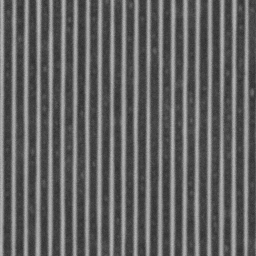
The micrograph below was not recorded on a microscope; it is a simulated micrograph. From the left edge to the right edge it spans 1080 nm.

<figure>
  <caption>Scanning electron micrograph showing parallel lines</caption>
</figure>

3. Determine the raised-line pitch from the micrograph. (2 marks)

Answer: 51.6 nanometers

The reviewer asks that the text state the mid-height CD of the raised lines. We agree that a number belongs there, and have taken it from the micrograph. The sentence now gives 12.1 nanometres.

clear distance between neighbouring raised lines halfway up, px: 8.63